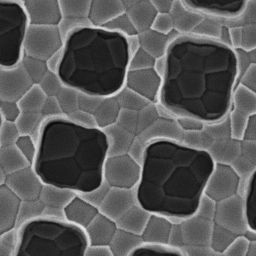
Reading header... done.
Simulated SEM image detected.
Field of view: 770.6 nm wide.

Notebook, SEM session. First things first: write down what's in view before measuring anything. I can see holes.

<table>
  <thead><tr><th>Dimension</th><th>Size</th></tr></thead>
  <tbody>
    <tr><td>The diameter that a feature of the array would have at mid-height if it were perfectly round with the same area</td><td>72.9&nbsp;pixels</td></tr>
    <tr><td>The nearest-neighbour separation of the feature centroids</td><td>302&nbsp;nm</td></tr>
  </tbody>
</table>